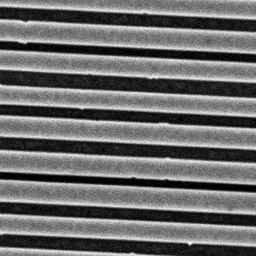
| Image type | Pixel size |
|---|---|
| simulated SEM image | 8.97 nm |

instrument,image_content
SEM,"parallel lines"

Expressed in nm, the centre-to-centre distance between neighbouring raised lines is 289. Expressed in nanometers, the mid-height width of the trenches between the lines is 112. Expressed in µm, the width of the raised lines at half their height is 0.189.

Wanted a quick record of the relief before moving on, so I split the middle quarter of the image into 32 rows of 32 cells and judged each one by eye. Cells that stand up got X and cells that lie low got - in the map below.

XXXXXXXXXXXXXXXXXXXXXXXXXXXXXXXX
XXXXXXXXXXXXXXXXXXXXXXXXXXXXXXXX
-----XXXXXXXXXXXXXXXXXXXXXXXXXXX
---------------------XXX-XXXXXXX
--------------------------------
--------------------------------
XXXX----------------------------
XXXXXXXXXXXXXXXXXXXXXXXX--------
XXXXXXXXXXXXXXXXXXXXXXXXXXXXXXXX
XXXXXXXXXXXXXXXXXXXXXXXXXXXXXXXX
XXXXXXXXXXXXXXXXXXXXXXXXXXXXXXXX
-----------------XXXXXXXXXXXXXXX
--------------------------------
--------------------------------
XXXXXXXXXXXXXXX-----------------
XXXXXXXXXXXXXXXXXXXXXXXXXXXXXXXX
XXXXXXXXXXXXXXXXXXXXXXXXXXXXXXXX
XXXXXXXXXXXXXXXXXXXXXXXXXXXXXXXX
XXXXXXXXXXXXXXXXXXXXXXXXXXXXXXXX
--------------XXXXXXXXXXXXXXXXXX
--------------------------------
--------------------------------
-XX-----------------------------
XXXXXXXXXXXXXXXXX---------------
XXXXXXXXXXXXXXXXXXXXXXXXXXXXXXXX
XXXXXXXXXXXXXXXXXXXXXXXXXXXXXXXX
XXXXXXXXXXXXXXXXXXXXXXXXXXXXXXXX
XXXXXXXXXXXXXXXXXXXXXXXXXXXXXXXX
---------------------XXXXXXXXXXX
--------------------------------
XXXXXXXXXXXXX-------------------
XXXXXXXXXXXXXXXXXXXXXXXXXXXXXXXX